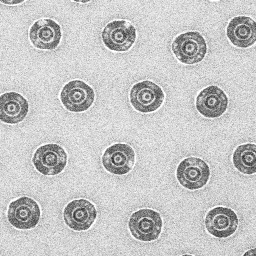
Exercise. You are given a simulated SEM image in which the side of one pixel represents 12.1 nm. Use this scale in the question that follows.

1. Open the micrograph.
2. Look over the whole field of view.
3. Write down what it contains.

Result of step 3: a regular array of ring-shaped raised bodies with a dot in the middle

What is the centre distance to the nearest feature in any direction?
725 nm